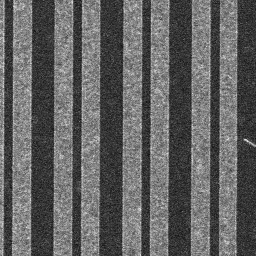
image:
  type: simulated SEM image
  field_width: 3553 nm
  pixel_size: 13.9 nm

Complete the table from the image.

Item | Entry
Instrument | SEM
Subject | parallel lines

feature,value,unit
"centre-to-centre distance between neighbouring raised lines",0.477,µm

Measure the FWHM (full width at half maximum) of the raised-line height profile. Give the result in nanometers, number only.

243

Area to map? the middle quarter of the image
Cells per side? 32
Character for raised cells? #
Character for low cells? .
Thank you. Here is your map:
##...####......####...####......
##...####......####...####......
##...####......####...####......
##...####......####...####......
##...####......####...####......
##...####......####...####......
##...####......####...####......
##...####......####...####......
##...####......####...####......
##...####......####...####......
##...####......####...####......
##...####......####...####......
##...####......####...####......
##...####......####...####......
##...####......####...####......
##...####......####...####......
##...####......####...####......
##...####......####...####......
##...####......####...####......
##...####......####...####......
##...####......####...####......
##...####......####...####......
##...####......####...####......
##...####......####...####......
##...####......####...####......
##...####......####...####......
##...####......####...####......
##...####......####...####......
##...####......####...####......
##...####......####...####......
##...####......####...####......
##...####......####...####......